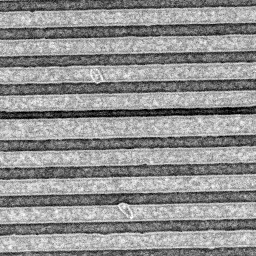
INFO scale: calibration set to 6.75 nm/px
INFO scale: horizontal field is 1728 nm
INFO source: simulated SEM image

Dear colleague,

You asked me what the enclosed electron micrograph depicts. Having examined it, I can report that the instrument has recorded parallel lines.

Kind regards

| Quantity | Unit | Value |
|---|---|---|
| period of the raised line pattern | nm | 189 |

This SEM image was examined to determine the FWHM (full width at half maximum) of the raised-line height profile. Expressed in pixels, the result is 16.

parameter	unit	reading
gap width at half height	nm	82.7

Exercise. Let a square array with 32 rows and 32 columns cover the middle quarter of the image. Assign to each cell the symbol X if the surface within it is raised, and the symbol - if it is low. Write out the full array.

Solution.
-------------XXXXXXXXXXXXXXXXXXX
XXXXXXXXXXXXXXXXXXXXXXXXXXXXXXXX
XXXXXXXXXXXXXXXXXXXXXXXXXXXXXXXX
XXXXXXXXXXXXXXXXXXXXXXXXXXXXXXXX
XX-----XX-----------------------
--------------------------------
--------------------------------
---------XX-----XXXXXXXXXXXXXXXX
XXXXXXXXXXXXXXXXXXXXXXXXXXXXXXXX
XXXXXXXXXXXXXXXXXXXXXXXXXXXXXXXX
XXXXXXXXXXXXXXXXXXXXXXXXXXXXXXXX
XXXXX---------------------------
--------------------------------
-----------XXXXXXXXXXXXXXXXXXXXX
XXXXXXXXXXXXXXXXXXXXXXXXXXXXXXXX
XXXXXXXXXXXXXXXXXXXXXXXXXXXXXXXX
XXXXXXXXXXXXXXXXXXXXXXXXXXXXXXXX
XXXXXXXXXXXXXXXXXXXXXXXXXXXXXXXX
X--XXXXX------------------------
--------------------------------
--------------------------------
------------XXXXXXXXXXXXXXXXXXXX
XXXXXXXXXXXXXXXXXXXXXXXXXXXXXXXX
XXXXXXXXXXXXXXXXXXXXXXXXXXXXXXXX
XXXXXXXXXXXXXXXXXXXXXXXXXXXXXXXX
--------------------------------
--------------------------------
--------------------------------
-------------XXXXXXXXXXXXXXXXXXX
XXXXXXXXXXXXXXXXXXXXXXXXXXXXXXXX
XXXXXXXXXXXXXXXXXXXXXXXXXXXXXXXX
XXXXXXXXXXXXXXXXXXXXXXXXXXXXXXXX